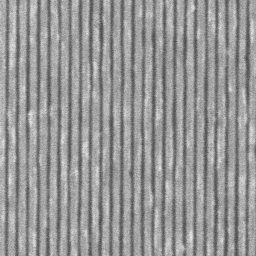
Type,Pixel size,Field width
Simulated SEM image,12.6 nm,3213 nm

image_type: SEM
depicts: parallel lines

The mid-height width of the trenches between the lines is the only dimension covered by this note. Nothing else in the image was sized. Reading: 58.1 nanometers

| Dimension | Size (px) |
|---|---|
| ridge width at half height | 6.13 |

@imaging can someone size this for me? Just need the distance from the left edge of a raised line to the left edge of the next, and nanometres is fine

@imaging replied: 131